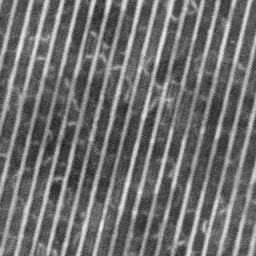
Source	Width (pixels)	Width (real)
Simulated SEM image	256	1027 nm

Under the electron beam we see parallel lines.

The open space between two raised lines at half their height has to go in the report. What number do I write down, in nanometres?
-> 48.2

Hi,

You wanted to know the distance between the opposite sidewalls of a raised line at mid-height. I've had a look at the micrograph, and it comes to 0.0127 µm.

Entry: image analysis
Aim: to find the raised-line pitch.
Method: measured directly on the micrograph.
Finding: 60.8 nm